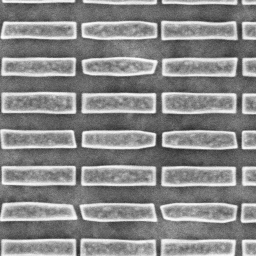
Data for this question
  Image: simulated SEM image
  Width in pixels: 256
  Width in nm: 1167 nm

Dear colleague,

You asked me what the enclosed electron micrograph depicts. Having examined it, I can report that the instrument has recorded wiring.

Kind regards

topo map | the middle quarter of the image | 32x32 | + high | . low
+++..++++++++++++++++++..+++++++
+++..+++++++++++++++++...+++++++
++...........++++........+++++++
................................
................................
................................
................................
.........................++++++.
++...++++++++++++++++++..+++++++
++...++++++++++++++++++..+++++++
+++..++++++++++++++++++..+++++++
+++..++++++++++++++++++..+++++++
................................
................................
................................
................................
................................
++...+++++++++++++++++...+++++++
++...++++++++++++++++++..+++++++
+++..++++++++++++++++++..+++++++
+++...+++++++++++++++.....++++++
................................
................................
................................
................................
................................
+++..+++++++++++++++++...+++++++
+++..+++++++++++++++++...+++++++
+++..+++++++++++++++++...+++++++
++...+++++++++++++++++...+++++++
................................
................................